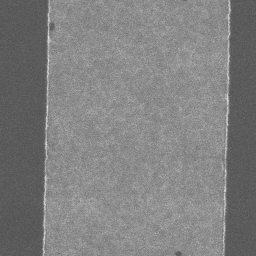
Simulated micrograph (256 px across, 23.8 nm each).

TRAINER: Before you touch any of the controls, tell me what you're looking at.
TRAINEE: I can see one or a few lines or trenches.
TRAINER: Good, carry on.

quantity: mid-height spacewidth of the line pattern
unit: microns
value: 4.22